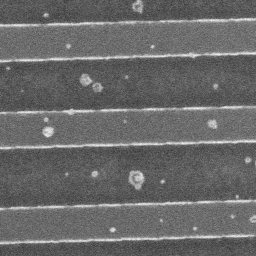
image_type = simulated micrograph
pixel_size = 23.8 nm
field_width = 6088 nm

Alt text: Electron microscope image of lines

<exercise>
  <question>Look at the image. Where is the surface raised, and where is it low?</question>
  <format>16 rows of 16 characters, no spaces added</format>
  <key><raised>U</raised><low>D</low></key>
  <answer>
DDDDDDDDDDDDDDDD
DDDDDUUUUUUUUUUU
UUUUUUUUUUUUUUUU
UUUUUUUUUUUUDDDD
DDDDDDDDDDDDDDDD
DDDDDDDDDDDDDDDD
DDDDDDDDDDDDDDDD
UUUUUUUUUUUUUUUU
UUUUUUUUUUUUUUUU
DDDDDDDDDDDDDDDD
DDDDDDDDDDDDDDDD
DDDDDDDDDDDDDDDD
DDDDDDDDDDDDDDDD
UUUUUUUUUUUUUUUU
UUUUUUUUUUUUUUUU
DDDDDDDDDDDDDDDD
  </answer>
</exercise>